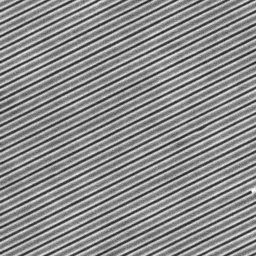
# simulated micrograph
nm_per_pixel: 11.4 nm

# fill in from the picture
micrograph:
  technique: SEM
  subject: parallel lines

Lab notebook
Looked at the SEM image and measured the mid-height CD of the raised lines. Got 94.3 nanometers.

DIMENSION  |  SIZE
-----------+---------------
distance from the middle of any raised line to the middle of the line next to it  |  130 nanometres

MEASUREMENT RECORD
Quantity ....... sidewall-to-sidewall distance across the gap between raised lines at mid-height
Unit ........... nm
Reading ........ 38.2